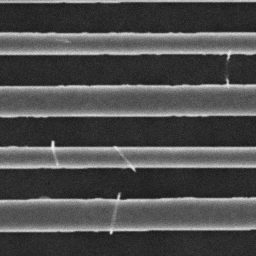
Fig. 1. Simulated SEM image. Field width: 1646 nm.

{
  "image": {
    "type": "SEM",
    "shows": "lines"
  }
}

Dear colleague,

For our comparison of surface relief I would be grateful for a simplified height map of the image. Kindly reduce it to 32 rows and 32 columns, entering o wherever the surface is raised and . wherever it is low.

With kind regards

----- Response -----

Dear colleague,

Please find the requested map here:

................................
................................
................................
................................
oooooooooooooooooooooooooooooooo
oooooooooooooooooooooooooooooooo
oooooooooooooooooooooooooooooooo
................................
................................
................................
............................o...
oooooooooooooooooooooooooooooooo
oooooooooooooooooooooooooooooooo
oooooooooooooooooooooooooooooooo
oooooooooooooooooooooooooo......
................................
................................
................................
oooooooooooooooooooooooooooooooo
oooooooooooooooooooooooooooooooo
oooooooooooooooooooooooooooooooo
................................
................................
................................
................................
oooooooooooooooooooooooooooooooo
oooooooooooooooooooooooooooooooo
oooooooooooooooooooooooooooooooo
oooooooooooooooooooooooooooooooo
................................
................................
................................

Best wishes